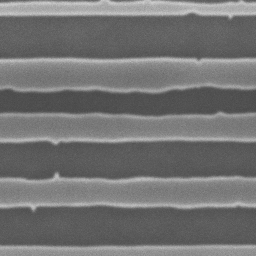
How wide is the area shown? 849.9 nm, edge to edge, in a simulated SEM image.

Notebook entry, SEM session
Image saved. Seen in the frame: one or a few lines or trenches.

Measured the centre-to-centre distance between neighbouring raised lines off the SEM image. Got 0.203 um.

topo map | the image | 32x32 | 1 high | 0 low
11111111111111111111111100001111
11111111111111111111111111111111
00000000000000000000000000000000
00000000000000000000000000000000
00000000000000000000000000000000
00000000000000000000000000000000
00000000000000000000000000000000
00001110111000011111111101100111
11111111111111111111111111111111
11111111111111111111111111111111
11111111111111111111111111111111
00000000000000000000000000000000
00000000000000000000000000000000
00000000000000000000000000000000
11111111111111111000000110111111
11111111111111111111111111111111
11111111111111111111111111111111
11100011100111110000000000000111
00000000000000000000000000000000
00000000000000000000000000000000
00000000000000000000000000000000
00000000000000000000000000000000
11100011111110001111111111111111
11111111111111111111111111111111
11111111111111111111111111111111
11111111111101111111111111111111
00000000000000000000000000000000
00000000000000000000000000000000
00000000000000000000000000000000
00000000000000000000000000000000
00000000000000000000000000000000
11111111111111111111111111111111